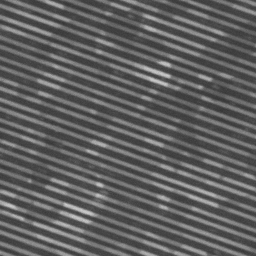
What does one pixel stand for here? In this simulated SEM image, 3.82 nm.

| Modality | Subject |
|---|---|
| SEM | parallel lines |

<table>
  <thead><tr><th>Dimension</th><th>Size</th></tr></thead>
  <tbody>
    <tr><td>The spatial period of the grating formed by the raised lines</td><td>37.1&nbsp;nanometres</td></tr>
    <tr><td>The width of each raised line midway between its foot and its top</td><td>9.9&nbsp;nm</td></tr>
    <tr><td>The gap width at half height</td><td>26.1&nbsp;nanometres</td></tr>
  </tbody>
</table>